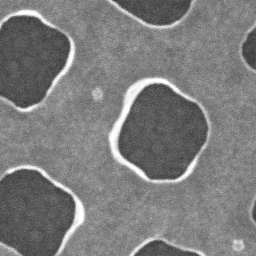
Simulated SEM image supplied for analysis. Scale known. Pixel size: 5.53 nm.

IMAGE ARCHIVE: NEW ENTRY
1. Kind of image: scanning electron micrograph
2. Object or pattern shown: holes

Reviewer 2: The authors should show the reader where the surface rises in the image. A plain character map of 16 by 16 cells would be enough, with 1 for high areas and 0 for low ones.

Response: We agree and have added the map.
1111111100001111
0001111110011111
0000111111111110
0000111111111110
0000111111111111
0001111110011111
1011111100001111
1111111100000111
1111111000000111
1111111000001111
1111111100001111
0001111111111111
0000011111111111
0000011111111111
0000111111111111
1000111110011111